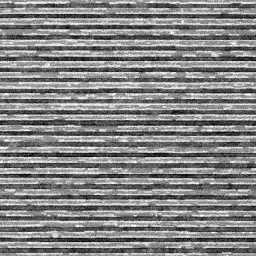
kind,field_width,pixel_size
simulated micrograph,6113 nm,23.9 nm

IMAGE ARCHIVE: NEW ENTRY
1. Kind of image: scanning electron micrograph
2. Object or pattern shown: parallel lines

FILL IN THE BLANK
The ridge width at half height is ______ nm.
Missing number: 131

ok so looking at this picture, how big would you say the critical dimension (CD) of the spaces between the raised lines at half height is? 110 nm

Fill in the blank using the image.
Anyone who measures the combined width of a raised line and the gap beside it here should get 0.254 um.